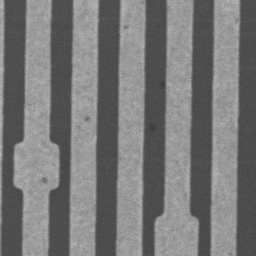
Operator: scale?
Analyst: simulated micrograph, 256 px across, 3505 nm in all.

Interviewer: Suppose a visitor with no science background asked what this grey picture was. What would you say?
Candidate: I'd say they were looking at wiring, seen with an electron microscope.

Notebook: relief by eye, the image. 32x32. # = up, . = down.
...###...###...###...###...###..
...###...###...###...###...###..
...###...###...###...###...###..
...###...###...###...###...###..
...###...###...###...###...###..
...###...###...###...###...###..
...###...###...###...###...###..
...###...###...###...###...###..
...###...###...###...###...###..
...###...###...###...###...###..
...###...###...###...###...###..
...###...###...###...###...###..
...###...###...###...###...###..
...###...###...###...###...###..
...###...###...###...###...###..
...###...###...###...###...###..
...###...###...###...###...###..
...###...###...###...###...###..
..#####..###...###...###...###..
..#####..###...###...###...###..
..#####..###...###...###...###..
..#####..###...###...###...###..
..#####..###...###...###...###..
..#####..###...###...###...###..
...###...###...###...###..###...
...###...###...###...###..###...
...###...###...###..####..###...
...###...###...###..#####.###...
...###...###...###.######.###...
...###...###...###.######.###...
...###...###...###.######.###...
...###...###...###.######.###...